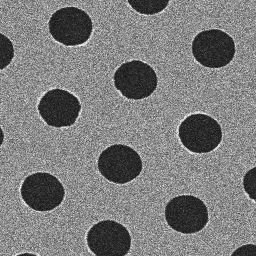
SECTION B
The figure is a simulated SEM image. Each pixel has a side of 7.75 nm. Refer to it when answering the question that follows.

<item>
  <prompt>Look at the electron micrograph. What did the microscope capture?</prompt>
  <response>a regular array of holes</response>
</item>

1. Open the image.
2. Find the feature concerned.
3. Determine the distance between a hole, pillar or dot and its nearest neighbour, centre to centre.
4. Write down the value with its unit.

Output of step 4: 635 nm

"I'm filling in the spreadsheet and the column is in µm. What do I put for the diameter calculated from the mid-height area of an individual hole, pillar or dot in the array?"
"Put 0.319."